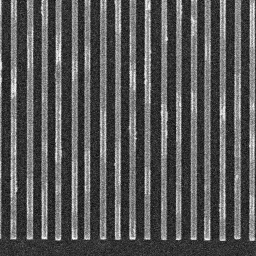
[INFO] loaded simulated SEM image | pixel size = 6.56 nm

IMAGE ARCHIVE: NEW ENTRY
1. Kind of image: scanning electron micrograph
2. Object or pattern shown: parallel lines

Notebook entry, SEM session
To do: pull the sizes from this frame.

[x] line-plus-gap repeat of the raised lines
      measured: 14.9 px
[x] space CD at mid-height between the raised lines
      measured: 0.0632 um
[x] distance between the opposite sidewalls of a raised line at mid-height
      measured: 0.0377 um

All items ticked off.